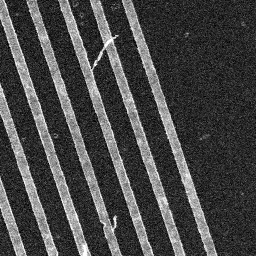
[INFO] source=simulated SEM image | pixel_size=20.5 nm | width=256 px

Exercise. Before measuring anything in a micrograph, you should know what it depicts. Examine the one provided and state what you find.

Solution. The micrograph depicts parallel lines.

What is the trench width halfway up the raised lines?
439 nanometers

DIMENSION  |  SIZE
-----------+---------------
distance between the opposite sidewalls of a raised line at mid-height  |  182 nanometres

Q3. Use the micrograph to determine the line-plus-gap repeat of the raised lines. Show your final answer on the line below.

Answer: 618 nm